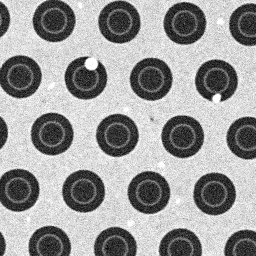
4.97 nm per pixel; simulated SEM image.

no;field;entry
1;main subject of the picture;an array of small figures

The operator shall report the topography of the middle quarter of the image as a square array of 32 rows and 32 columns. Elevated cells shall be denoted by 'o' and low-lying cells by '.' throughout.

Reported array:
o...oooo..oooooooo........oooooo
...ooooo...oooooo...oooo...ooooo
..oooooo...oooooo..oooooo..ooo.o
..oooooo...ooooo...oooooo..ooooo
..oooooo...ooooo...oooooo..ooooo
...ooooo...oooooo..ooooo...ooooo
o...oo....ooooooo...oooo...ooooo
oo.......ooooooooo........oooooo
ooo.....ooooooooooo......ooooooo
oooooooooooooooooooooooooooooooo
oooooooooooooooooooooooooooooooo
oooooooooooooooooooooooooooooooo
oooooooooooo...ooooooooooooooooo
.ooooooooo.......oooo..oooo.....
..ooooooo.........oooo..o.......
..oooooo...oooo...ooooooo...ooo.
..oooooo...ooooo...ooooo...ooooo
..oooooo..oooooo...ooooo...ooooo
..oooooo..oooooo...ooooo...ooooo
..oooooo...ooooo..oooooo...ooooo
..ooooooo...ooo...ooooooo...oooo
.ooo.oooo........oooooooo.......
oooooooooo......oooooooooo......
oooooooooooooooooooooooooooo...o
oooooooooooooooooooooooooooooooo
oooooooooooooooooooooooooooooooo
oooo..oooooooooooooooooooooooooo
oo......oooooooooo......oooooooo
o........oooooooo........ooooooo
...oooo...ooooooo...ooo...oooooo
..oooooo..oooooo..oooooo..oooooo
..oooooo..oooooo..oooooo...ooooo